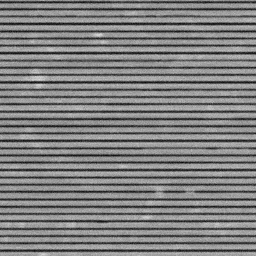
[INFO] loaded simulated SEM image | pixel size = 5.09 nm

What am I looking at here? parallel lines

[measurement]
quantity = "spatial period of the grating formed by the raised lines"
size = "37.2 nm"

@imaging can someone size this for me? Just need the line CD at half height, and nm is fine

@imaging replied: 26.7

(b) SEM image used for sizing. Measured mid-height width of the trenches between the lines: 8.9 nanometres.